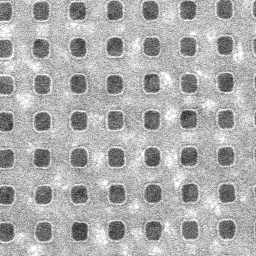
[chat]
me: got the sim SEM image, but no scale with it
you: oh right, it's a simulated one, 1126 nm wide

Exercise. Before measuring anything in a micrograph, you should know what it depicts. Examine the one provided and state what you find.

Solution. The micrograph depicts a regular array of raised bodies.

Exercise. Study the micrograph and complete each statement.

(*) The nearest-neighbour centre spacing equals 160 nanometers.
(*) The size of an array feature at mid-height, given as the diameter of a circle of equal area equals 92.8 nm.